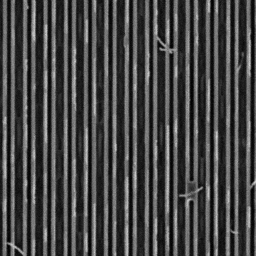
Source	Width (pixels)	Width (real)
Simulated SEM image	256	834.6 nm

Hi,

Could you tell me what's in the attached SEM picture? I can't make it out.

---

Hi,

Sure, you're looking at parallel lines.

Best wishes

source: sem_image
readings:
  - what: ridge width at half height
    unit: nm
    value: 13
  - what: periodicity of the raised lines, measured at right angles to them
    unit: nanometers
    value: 33.1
